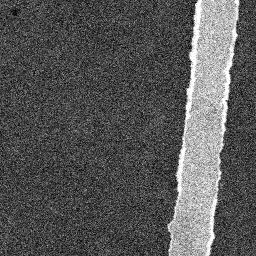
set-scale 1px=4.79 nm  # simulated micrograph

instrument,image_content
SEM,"one or a few lines or trenches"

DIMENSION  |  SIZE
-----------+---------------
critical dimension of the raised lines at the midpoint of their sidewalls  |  191 nm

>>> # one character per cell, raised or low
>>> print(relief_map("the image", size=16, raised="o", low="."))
............ooo.
............ooo.
............ooo.
............ooo.
............oo..
............oo..
............oo..
............oo..
............oo..
...........ooo..
...........ooo..
...........ooo..
...........ooo..
...........oo...
...........oo...
...........oo...